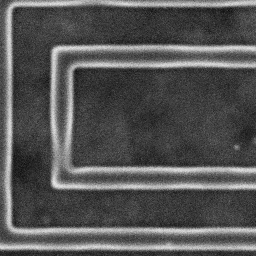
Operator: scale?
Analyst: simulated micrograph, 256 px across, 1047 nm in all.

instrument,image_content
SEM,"groups of lines, slits or small figures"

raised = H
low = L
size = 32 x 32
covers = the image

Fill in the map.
HHHHHHHHLLLLLLLHHHHHHHHHHHHHHLLL
HLLLLLLLLLLLLLLLLLLLLLLLLLLLLLLL
HLLLLLLLLLLLLLLLLLLLLLLLLLLLLLLL
HLLLLLLLLLLLLLLLLLLLLLLLLLLLLLLL
HLLLLLLLLLLLLLLLLLLLLLLLLLLLLLLL
HLLLLLLLLLLLLLLLLLLLLLLLLLLLLLLL
HLLLLLLHHHHHHHHHHHHHHHHHHHHHHHHH
HLLLLLLHHHHHHHHHHHHHHHHHHHHHHHHH
HLLLLLLHHLLLLLLLLLLLLLLLLLLLLLLL
HLLLLLLHHLLLLLLLLLLLLLLLLLLLLLLL
HLLLLLLHHLLLLLLLLLLLLLLLLLLLLLLL
HLLLLLLHHLLLLLLLLLLLLLLLLLLLLLLL
HLLLLLLHHLLLLLLLLLLLLLLLLLLLLLLL
HLLLLLLHHLLLLLLLLLLLLLLLLLLLLLLL
HLLLLLLHHLLLLLLLLLLLLLLLLLLLLLLL
HLLLLLLHHLLLLLLLLLLLLLLLLLLLLLLL
HLLLLLLHHLLLLLLLLLLLLLLLLLLLLLLL
HLLLLLLHHLLLLLLLLLLLLLLLLLLLLLLL
HLLLLLLHHLLLLLLLLLLLLLLLLLLLLLLL
HLLLLLLHHLLLLLLLLLLLLLLLLLLLLLLL
HLLLLLLHHLLLLLLLLLLLLLLLLLLLLLLL
HLLLLLLHHHHHHHHHHHHHHHHHHHHHHHHH
HLLLLLLHHHHHHHHHHHHHHHHHHHHHHHHH
HLLLLLLLLLLLLLLLLLLLLLLLLLLLLLLL
HLLLLLLLLLLLLLLLLLLLLLLLLLLLLLLL
HLLLLLLLLLLLLLLLLLLLLLLLLLLLLLLL
HLLLLLLLLLLLLLLLLLLLLLLLLLLLLLLL
HLLLLLLLLLLLLLLLLLLLLLLLLLLLLLLL
HHLLLLLLLLLLLLLLLLLLLLLLLLLLLLLL
HHHHHHHHHHHHHHHHHHHHHHHHHHHHHHHH
HHHHHHHHHHHHHHHHHHHHHHHHHHHHHHHH
LLLLLLLLLLLLLLLLLLLLLLLLLLLLLLLL